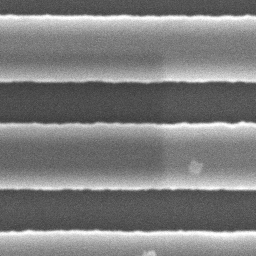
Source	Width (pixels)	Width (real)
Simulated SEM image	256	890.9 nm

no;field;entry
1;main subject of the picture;lines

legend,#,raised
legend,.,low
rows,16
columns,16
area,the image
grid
................
################
################
################
################
................
................
................
################
################
################
################
................
................
#############..#
################